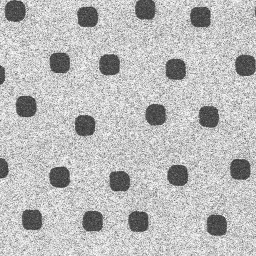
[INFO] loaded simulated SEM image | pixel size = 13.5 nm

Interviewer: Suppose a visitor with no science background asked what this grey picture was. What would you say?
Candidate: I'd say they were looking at a regular array of holes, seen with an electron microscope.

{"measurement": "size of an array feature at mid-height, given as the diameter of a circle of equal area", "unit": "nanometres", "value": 298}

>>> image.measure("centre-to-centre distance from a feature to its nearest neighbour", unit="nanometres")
689